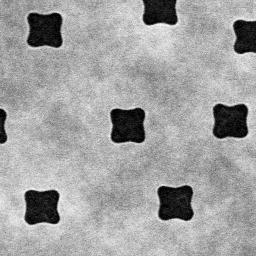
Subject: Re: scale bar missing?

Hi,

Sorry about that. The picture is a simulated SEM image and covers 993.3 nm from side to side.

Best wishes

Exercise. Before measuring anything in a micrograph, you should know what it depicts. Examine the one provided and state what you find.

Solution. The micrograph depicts holes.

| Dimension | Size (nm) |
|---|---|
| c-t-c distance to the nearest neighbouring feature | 382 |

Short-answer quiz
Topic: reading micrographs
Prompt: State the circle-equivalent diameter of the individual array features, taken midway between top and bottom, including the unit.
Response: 147 nm